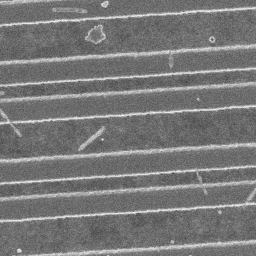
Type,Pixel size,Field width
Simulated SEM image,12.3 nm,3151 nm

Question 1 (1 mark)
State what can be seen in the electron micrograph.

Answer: lines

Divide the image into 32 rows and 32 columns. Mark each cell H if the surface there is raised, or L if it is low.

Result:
HHHHHHHHHHHHHHHHHHHHHHHHHHHHHHHH
HHHHHHHHHHHHHHHHHHHHHHHHLLLLLLLL
HHHHHHHHLLLLLLLLLLLLLLLLLLLLLLLL
LLLLLLLLLLLLLLLLLLLLLLLLLLLLLLLL
LLLLLLLLLLLLLLLLLLLLLLLLLLLLLLLL
LLLLLLLLLLLLLLLLLLLLLLLLLLLLLLLL
LLLLLLLLLLLLLLLLLLLLLHHHHHHHHHHH
LLLLLLHHHHHHHHHHHHHHHHHHHHHHHHHH
HHHHHHHHHHHHHHHHHHHHHHHHHHHHHHHH
HHHHHHHHHHHHHHHHHHLLLLLLLLLLLLLL
HHHLLLLLLLLLLLLLLLLLLLLLLLLLLLLH
LLLLLLLLLLLLLLLLHHHHHHHHHHHHHHHH
LHHHHHHHHHHHHHHHHHHHHHHHHHHHHHHH
HHHHHHHHHHHHHHHHHHHHHHHHHHHHHLLL
HHHHHHHHHHHHHLLLLLLLLLLLLLLLLLLL
LLLLLLLLLLLLLLLLLLLLLLLLLLLLLLLL
LLLLLLLLLLLLLLLLLLLLLLLLLLLLLLLL
LLLLLLLLLLLLLLLLLLLLLLLLLLLLLLLL
LLLLLLLLLLLLLLLLLLLLLLLLLHHHHHHH
LLLLLLLLLLLHHHHHHHHHHHHHHHHHHHHH
HHHHHHHHHHHHHHHHHHHHHHHHHHHHHHHH
HHHHHHHHHHHHHHHHHHHHHLLLLLLLLLLL
HHHHHHHLLLLLLLLLLLLLLLLLLLLLLLLL
LLLLLLLLLLLLLLLLLLLLHHHHHHHHHHHH
LLLLLLHHHHHHHHHHHHHHHHHHHHHHHHHH
HHHHHHHHHHHHHHHHHHHHHHHHHHHHHHHH
HHHHHHHHHHHHHHHHHHLLLLLLLLLLLLLL
HHHLLLLLLLLLLLLLLLLLLLLLLLLLLLLL
LLLLLLLLLLLLLLLLLLLLLLLLLLLLLLLL
LLLLLLLLLLLLLLLLLLLLLLLLLLLLLLLL
LLLLLLLLLLLLLLLLLLLLLLLLLLLLHHHH
LLLLLLLLLLLLLHHHHHHHHHHHHHHHHHHH